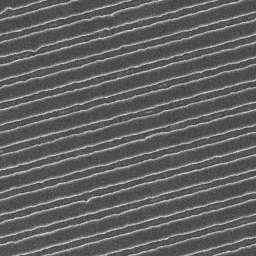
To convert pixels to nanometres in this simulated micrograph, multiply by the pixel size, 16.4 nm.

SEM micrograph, parallel lines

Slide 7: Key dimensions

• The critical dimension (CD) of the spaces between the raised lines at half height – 0.111 µm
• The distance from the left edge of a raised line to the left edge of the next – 21.7 px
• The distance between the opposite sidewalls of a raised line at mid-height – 250 nm